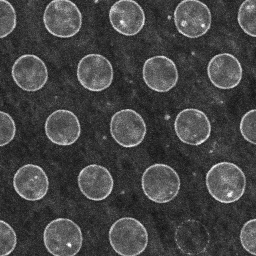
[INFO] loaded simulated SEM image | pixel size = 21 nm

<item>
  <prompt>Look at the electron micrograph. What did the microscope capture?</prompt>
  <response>a regular array of raised bodies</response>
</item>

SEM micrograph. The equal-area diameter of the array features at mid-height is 0.734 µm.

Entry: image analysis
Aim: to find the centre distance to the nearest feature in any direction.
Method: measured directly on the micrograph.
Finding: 1330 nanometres